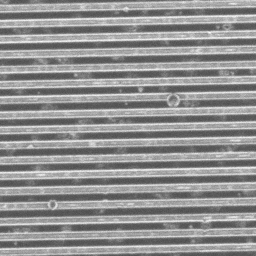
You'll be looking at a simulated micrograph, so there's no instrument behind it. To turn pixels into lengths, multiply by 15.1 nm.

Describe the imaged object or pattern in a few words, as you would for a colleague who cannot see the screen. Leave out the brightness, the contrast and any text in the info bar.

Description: parallel lines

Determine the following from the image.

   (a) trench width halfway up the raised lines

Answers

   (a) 81.4 nm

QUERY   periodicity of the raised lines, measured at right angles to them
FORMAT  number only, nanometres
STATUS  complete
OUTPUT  230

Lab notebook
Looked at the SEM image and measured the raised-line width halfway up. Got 148 nm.